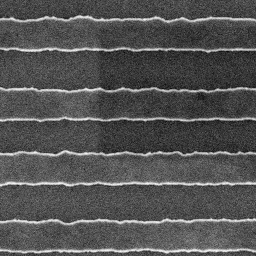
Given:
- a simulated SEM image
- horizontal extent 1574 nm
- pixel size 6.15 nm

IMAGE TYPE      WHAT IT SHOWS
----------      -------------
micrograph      lines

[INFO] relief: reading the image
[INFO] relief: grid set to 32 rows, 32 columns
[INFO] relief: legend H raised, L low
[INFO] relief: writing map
LLLLLLLLLLLLLLLLLLLLLLLLLLLLLLLL
LLLLLLLLLLLLLLLLLLLLLLLLLLLLLLLL
HHLLHHHHHHHHHHHHHHHHHLHLHHHHHHHH
HHHHHHHHHHHHHHHHHHHHHHHHHHHHHHHH
HHHHHHHHHHHHHHHHHHHHHHHHHHHHHHHH
HHHHHHHHHHHHHHHHHHHHHHHHHHHHHHHH
LLLLLLLLLLLLLLLLLLLLLLLLLLLLLLLL
LLLLLLLLLLLLLLLLLLLLLLLLLLLLLLLL
LLLLLLLLLLLLLLLLLLLLLLLLLLLLLLLL
LLLLLLLLLLLLLLLLLLLLLLLLLLLLLLLL
LLLLLLLLLLLLLLLLLLLLLLLLLLLLLLLL
HHHHHHHHHHHHHHHHHHHHHHHHHHHHHHHH
HHHHHHHHHHHHHHHHHHHHHHHHHHHHHHHH
HHHHHHHHHHHHHHHHHHHHHHHHHHHHHHHH
HHHHHHHHHHHHHHHHHHHHHHHHHHHHHHHH
LLLLLLLLLLLLLLLLLLLLLLLLLLLLLLLL
LLLLLLLLLLLLLLLLLLLLLLLLLLLLLLLL
LLLLLLLLLLLLLLLLLLLLLLLLLLLLLLLL
LLLLLLLLLLLLLLLLLLLLLLLLLLLLLLLL
HHHHHHHHHHHHHHHHHHHHHHHHHHHHHHHH
HHHHHHHHHHHHHHHHHHHHHHHHHHHHHHHH
HHHHHHHHHHHHHHHHHHHHHHHHHHHHHHHH
HHHHHHHHHHHHHHHHHHHHHHHHHHHHHHHH
LLLLLLLLLLLLLLLLLLLLLLLLLLLLLLLL
LLLLLLLLLLLLLLLLLLLLLLLLLLLLLLLL
LLLLLLLLLLLLLLLLLLLLLLLLLLLLLLLL
LLLLLLLLLLLLLLLLLLLLLLLLLLLLLLLL
LLLLLLLLLLLLHLLLLLLLLLLLLLHLLLHH
HHHHHHHHHHHHHHHHHHHHHHHHHHHHHHHH
HHHHHHHHHHHHHHHHHHHHHHHHHHHHHHHH
HHHHHHHHHHHHHHHHHHHHHHHHHHHHHHHH
LLHHHHLLLLLLLLLLLLLLHHLLLLLLLLLL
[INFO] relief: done